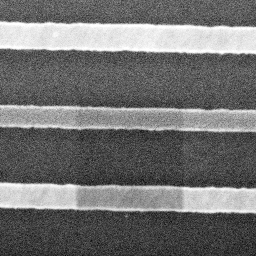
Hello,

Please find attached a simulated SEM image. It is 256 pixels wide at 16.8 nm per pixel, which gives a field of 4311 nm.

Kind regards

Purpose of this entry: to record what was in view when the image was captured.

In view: lines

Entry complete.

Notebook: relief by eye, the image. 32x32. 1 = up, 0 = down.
00000000000000000000000000000000
00000000000000000000000000000000
00000000000000000000000000000000
11111111111111111111111111111111
11111111111111111111111111111111
11111111111111111111111111111111
00000000000000000000000011111111
00000000000000000000000000000000
00000000000000000000000000000000
00000000000000000000000000000000
00000000000000000000000000000000
00000000000000000000000000000000
00000000000000000000000000000000
11111111100000000000000000000000
11111111111111111111111111111111
11111111111111111111111111111111
00000000000000000000000000000000
00000000000000000000000000000000
00000000000000000000000000000000
00000000000000000000000000000000
00000000000000000000000000000000
00000000000000000000000000000000
00000000000000000000000000000000
11111111111111111111111100000000
11111111111111111111111111111111
11111111111111111111111111111111
00000000000000000000000000000001
00000000000000000000000000000000
00000000000000000000000000000000
00000000000000000000000000000000
00000000000000000000000000000000
00000000000000000000000000000000